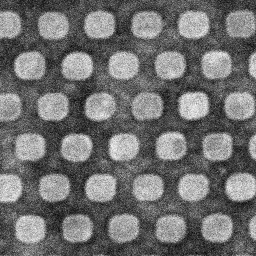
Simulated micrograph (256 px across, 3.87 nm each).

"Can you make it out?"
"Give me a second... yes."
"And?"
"a regular array of raised bodies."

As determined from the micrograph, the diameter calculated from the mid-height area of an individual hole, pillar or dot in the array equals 107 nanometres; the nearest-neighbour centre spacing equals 179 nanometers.